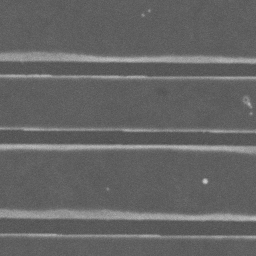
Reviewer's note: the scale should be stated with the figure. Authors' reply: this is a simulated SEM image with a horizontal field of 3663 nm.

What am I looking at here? lines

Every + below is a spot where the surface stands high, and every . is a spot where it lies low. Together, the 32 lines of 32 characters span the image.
++++++++++++++++++++++++++++++++
++++++++++++++++++++++++++++++++
++++++++++++++++++++++++++++++++
++++++++++++++++++++++++++++++++
++++++++++++++++++++++++++++++++
++++++++++++++++++++++++++++++++
++++++++++++++++++++++++++++++++
................+.........++++++
................................
+++++++.........................
++++++++++++++++++++++++++++++++
++++++++++++++++++++++++++++++++
++++++++++++++++++++++++++++++++
++++++++++++++++++++++++++++++++
++++++++++++++++++++++++++++++++
++++++++++++++++++++++++++++++++
................................
................................
+++++++++++++++++++++++++++++...
++++++++++++++++++++++++++++++++
++++++++++++++++++++++++++++++++
++++++++++++++++++++++++++++++++
++++++++++++++++++++++++++++++++
++++++++++++++++++++++++++++++++
++++++++++++++++++++++++++++++++
++++++++++++++++++++++++++++++++
++++++++++++++++++++++++++++++++
................................
................................
++++++++++++++++++++............
++++++++++++++++++++++++++++++++
++++++++++++++++++++++++++++++++